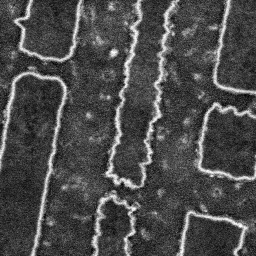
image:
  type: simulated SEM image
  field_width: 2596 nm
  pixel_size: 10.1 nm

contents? one or a few lines or trenches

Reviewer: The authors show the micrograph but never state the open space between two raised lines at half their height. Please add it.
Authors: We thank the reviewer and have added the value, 0.577 um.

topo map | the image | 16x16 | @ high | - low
--@@@----@@---@@
-@@@@----@----@@
-@@@@---@@----@@
--@@----@@----@@
--------@@---@@@
-@@@----@@----@@
-@@@----@@------
@@@@---@@@---@@@
@@@----@@----@@@
@@@----@@----@@@
@@@----@@----@@@
@@@-----@-------
@@@-------------
@@@---@@----@---
@@----@@----@@@-
@@----@@---@@@@-